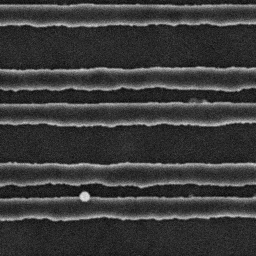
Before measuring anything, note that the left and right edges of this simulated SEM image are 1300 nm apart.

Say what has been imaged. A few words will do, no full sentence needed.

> lines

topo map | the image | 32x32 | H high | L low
LLLLLLLLLLLLLLLLLLLLLLLLLLLLLLLL
HHHHHHHHHHHHHHHHHHHHHHHHHHHHHHHH
HHHHHHHHHHHHHHHHHHHHHHHHHHHHHHHH
LLLLLLLLLLLLLLLLLLLLLLLLLLLLLLLL
LLLLLLLLLLLLLLLLLLLLLLLLLLLLLLLL
LLLLLLLLLLLLLLLLLLLLLLLLLLLLLLLL
LLLLLLLLLLLLLLLLLLLLLLLLLLLLLLLL
LLLLLLLLLLLLLLLLLLLLLLLLLLLLLLLL
LLLLLLLLLLLLLLLLLLLHLLLLHHLLLHLL
HHHHHHHHHHHHHHHHHHHHHHHHHHHHHHHH
HHHHHHHHHHHHHHHHHHHHHHHHHHHHHHHH
LLLLLLLLLLLLLLLLLLLLLLLLLLLLLLLL
LLLLLLLLLLLLLLLLLLLLLLLLLLLLLLLL
HHHHHHHHHHHHHHHHHHHHHHHHHHHHHHHH
HHHHHHHHHHHHHHHHHHHHHHHHHHHHHHHH
LHHLLLHHHHHHHHHHHHHHLHHHHHHHLLLL
LLLLLLLLLLLLLLLLLLLLLLLLLLLLLLLL
LLLLLLLLLLLLLLLLLLLLLLLLLLLLLLLL
LLLLLLLLLLLLLLLLLLLLLLLLLLLLLLLL
LLLLLLLLLLLLLLLLLLLLLLLLLLLLLLLL
HHHHHHHHLHHHLLHHHHHHHLHHHHHHHHHH
HHHHHHHHHHHHHHHHHHHHHHHHHHHHHHHH
HHHHHHHHHHHHHHHHHHHHHHHHHHHHHHHH
LLLLLLLLLLLLLLLLLLLLLLLLLLLLLLLL
LLLLLLLLLLHLLLLLLLLLLLLLLLLLLLLL
HHHHHHHHHHHHHHHHHHHHHHHHHHHHHHHH
HHHHHHHHHHHHHHHHHHHHHHHHHHHHHHHH
HHLLLLHHHLLLLLLLLLLLLLLLLLLLLLLL
LLLLLLLLLLLLLLLLLLLLLLLLLLLLLLLL
LLLLLLLLLLLLLLLLLLLLLLLLLLLLLLLL
LLLLLLLLLLLLLLLLLLLLLLLLLLLLLLLL
LLLLLLLLLLLLLLLLLLLLLLLLLLLLLLLL